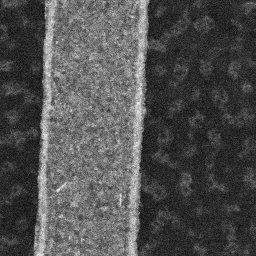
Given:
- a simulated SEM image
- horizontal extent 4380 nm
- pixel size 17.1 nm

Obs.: one or a few lines or trenches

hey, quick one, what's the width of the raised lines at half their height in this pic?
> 1560 nanometres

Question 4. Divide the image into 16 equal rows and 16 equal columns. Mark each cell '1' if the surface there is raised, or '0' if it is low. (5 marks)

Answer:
0001111110000000
0001111110000000
0001111110000000
0001111110000000
0001111110000000
0001111110000000
0001111110000000
0001111110000000
0001111110000000
0001111110000000
0001111100000000
0001111100000000
0001111100000000
0001111100000000
0001111100000000
0001111100000000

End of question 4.